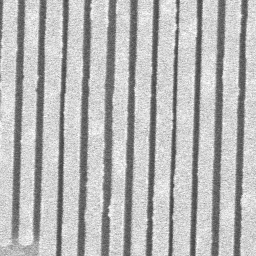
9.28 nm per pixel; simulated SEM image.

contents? parallel lines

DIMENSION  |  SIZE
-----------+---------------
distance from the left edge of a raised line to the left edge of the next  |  207 nanometers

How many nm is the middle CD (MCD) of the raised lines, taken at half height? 151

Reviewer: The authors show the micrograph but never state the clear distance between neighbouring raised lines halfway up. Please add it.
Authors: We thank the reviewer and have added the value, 6 pixels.